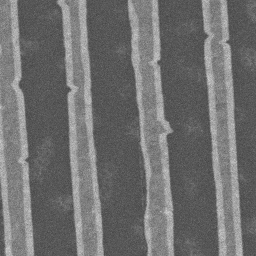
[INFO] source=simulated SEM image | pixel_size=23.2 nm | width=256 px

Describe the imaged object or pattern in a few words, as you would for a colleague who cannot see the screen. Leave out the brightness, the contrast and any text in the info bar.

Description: one or a few lines or trenches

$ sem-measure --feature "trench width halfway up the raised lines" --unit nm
1160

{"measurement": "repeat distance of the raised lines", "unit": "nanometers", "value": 1630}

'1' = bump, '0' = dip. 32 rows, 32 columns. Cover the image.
11000000110000001110000000110000
11000000110000000110000000110000
11000000110000000110000000110000
11000000110000000111000000110000
11000000111000000111000000110000
11000000011000000111000000110000
11000000011000000111000000110000
11000000011000000110000000110000
11000000011000000111000000111000
11000000011000000111000000111000
11000000011000000111000000111000
11000000011000000111000000111000
11100000011000000111000000111000
11100000011000000011000000011000
11100000011000000011000000011000
11100000011000000011100000011000
11100000011000000011100000011000
11100000011000000011000000011000
11100000011000000011100000011000
11100000011100000011100000011000
11100000011100000011100000011000
11100000011100000011100000011000
11100000011100000001100000011000
01100000011100000011100000011000
01100000001100000011100000011000
01100000001100000011100000011100
01100000001100000011100000011100
01110000001100000011100000001100
01110000001100000011100000001100
01110000001100000011100000001100
01110000001110000001100000001100
01110000001110000001100000001100